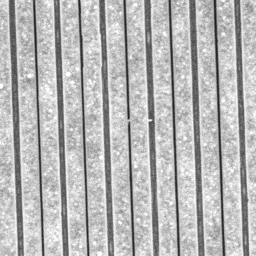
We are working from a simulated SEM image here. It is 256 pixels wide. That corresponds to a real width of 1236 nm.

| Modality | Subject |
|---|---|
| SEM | parallel lines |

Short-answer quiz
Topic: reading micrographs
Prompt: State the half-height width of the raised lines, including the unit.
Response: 0.0862 µm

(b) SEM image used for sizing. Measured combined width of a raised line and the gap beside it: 22.3 pixels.